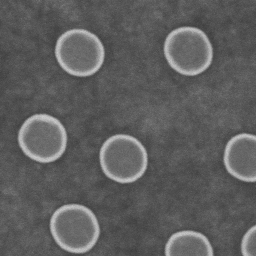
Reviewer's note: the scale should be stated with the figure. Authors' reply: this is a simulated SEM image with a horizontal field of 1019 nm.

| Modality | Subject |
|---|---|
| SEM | raised bodies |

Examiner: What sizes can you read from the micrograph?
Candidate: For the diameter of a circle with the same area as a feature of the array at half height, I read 180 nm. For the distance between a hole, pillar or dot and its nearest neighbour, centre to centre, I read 337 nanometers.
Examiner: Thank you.